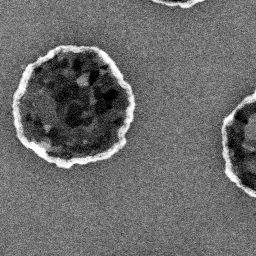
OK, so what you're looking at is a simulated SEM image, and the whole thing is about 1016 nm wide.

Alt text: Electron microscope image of raised bodies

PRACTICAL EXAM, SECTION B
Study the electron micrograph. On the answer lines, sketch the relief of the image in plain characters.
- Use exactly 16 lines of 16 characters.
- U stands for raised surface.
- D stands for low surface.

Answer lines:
DDDDDDDDDDDDDDDD
DDDDDDDDDDDDDDDD
DDDDDDDDDDDDDDDD
DDDUUUUDDDDDDDDD
DDUUUUUDDDDDDDDD
DUUUUUUUDDDDDDDD
DUUUUUUUDDDDDDDU
DUUUUUUUDDDDDDUU
DUUUUUUUDDDDDDUU
DDUUUUUDDDDDDDUU
DDDDDDDDDDDDDDUU
DDDDDDDDDDDDDDDU
DDDDDDDDDDDDDDDD
DDDDDDDDDDDDDDDD
DDDDDDDDDDDDDDDD
DDDDDDDDDDDDDDDD